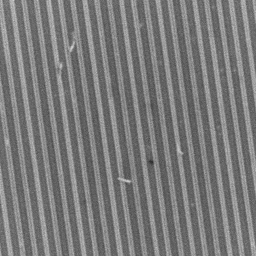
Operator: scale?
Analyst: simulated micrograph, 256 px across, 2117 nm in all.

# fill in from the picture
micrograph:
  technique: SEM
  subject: parallel lines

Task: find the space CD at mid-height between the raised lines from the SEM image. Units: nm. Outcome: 67.6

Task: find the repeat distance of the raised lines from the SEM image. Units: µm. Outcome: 0.0997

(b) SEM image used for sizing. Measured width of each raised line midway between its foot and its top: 29.7 nanometers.